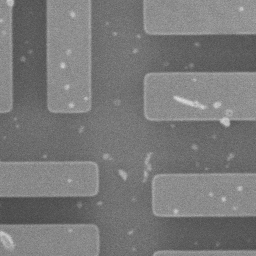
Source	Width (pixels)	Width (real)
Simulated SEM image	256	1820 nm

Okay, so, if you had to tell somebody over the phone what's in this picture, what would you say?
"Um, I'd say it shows groups of lines, slits or small figures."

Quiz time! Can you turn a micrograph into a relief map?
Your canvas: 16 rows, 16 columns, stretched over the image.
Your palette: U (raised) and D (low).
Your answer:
UDDUUUDDDUUUUUUU
UDDUUUDDDUUUUUUU
UDDUUUDDDDDDDDDD
UDDUUUDDDDDDDDDD
UDDUUUDDDDDDDDDD
UDDUUUDDDUUUUUUU
UDDUUUDDDUUUUUUU
DDDDDDDDDDUDDUUD
DDDDDDDDDDDDDDDD
DDDDDDDDDDDDDDDD
UUUUUUDDDDDDDDDD
UUUUUUDDDDUUUUUU
DDDDDDDDDDUUUUUU
DDDDDDDDDDDDDDDD
UUUUUUDDDDDDDDDD
UUUUUUDDDDDDDDDD